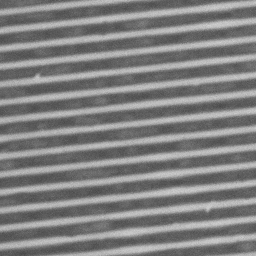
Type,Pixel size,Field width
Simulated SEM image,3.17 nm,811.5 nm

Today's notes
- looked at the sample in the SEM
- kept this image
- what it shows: parallel lines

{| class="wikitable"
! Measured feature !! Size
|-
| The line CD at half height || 14.6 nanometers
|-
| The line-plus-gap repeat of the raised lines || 56.7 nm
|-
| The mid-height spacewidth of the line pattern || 40.5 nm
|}